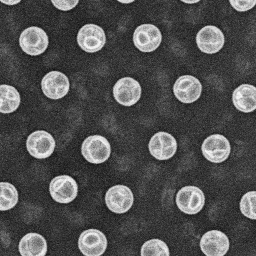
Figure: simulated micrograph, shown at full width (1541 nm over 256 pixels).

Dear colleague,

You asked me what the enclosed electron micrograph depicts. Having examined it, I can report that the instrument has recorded a regular array of raised bodies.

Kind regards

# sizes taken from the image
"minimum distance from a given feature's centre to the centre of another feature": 324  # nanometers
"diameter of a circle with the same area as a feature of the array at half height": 27.8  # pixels